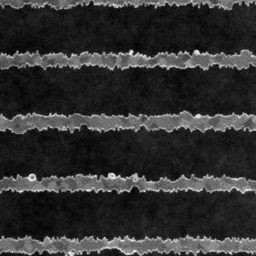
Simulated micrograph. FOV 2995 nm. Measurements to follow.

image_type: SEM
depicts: one or a few lines or trenches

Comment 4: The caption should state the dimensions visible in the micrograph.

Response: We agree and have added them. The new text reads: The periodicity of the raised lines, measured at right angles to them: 721 nanometers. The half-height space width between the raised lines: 570 nm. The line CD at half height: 150 nm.